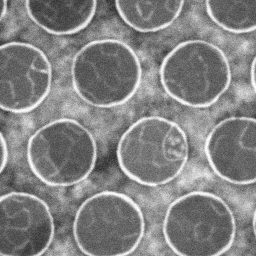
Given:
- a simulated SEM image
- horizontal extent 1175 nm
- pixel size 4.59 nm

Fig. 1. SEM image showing raised bodies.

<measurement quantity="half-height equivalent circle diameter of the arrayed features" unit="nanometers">307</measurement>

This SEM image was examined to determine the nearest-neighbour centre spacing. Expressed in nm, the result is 409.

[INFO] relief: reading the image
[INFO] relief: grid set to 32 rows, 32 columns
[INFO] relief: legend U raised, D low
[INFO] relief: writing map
UDDUUUUUUUUUDDDUUUUUUUUDDDUUUUUU
DDDDUUUUUUUUDDDUUUUUUUDDDDUUUUUU
DDDDUUUUUUUDDDDDUUUUUUDDDDDUUUUU
DDDDDDUUUUDDDDDDDUUUDDDDDDDDUUUU
DDDDDDDDDDDDDDDDDDDDDDDDDDDDDDDD
DUUDDDDDDDDUUUUUDDDDDDDUUUDDDDDD
UUUUUDDDDDUUUUUUUDDDDDUUUUUUDDDD
UUUUUUDDDUUUUUUUUDDDDUUUUUUUDDDD
UUUUUUDDDUUUUUUUUDDDUUUUUUUUUDDD
UUUUUUDDDUUUUUUUUDDDUUUUUUUUUDDD
UUUUUUDDDUUUUUUUUDDDUUUUUUUUDDDD
UUUUUUDDDDUUUUUUUDDDDUUUUUUUDDDD
UUUUUDDDDDDUUUUUDDDDDDUUUUUDDDDD
UUUUDDDDDDDDDDDDDDDDDDDDDDDDDDDD
DDDDDDDDDDDDDDDDDDDDDDDDDDDDDDDD
DDDDDDUUUUDDDDDDDUUUUUDDDDDUUUUU
DDDDDUUUUUUDDDDDUUUUUUUDDDUUUUUU
DDDDUUUUUUUUDDDUUUUUUUUDDDUUUUUU
UDDDUUUUUUUUDDDUUUUUUUUDDDUUUUUU
UDDDUUUUUUUUDDDUUUUUUUUDDDUUUUUU
DDDDUUUUUUUUDDDUUUUUUUUDDDDUUUUU
DDDDUUUUUUUDDDDDUUUUUUDDDDDUUUUU
DDDDDUUUUUDDDDDDDUUUUDDDDDDDDUUU
DDDDDDDDDDDDDDDDDDDDDDDDDDDDDDDD
DUUUDDDDDDDDUUUDDDDDDDDUUUUDDDDD
UUUUUUDDDDUUUUUUUDDDDDUUUUUUDDDD
UUUUUUDDDDUUUUUUUDDDDUUUUUUUUDDD
UUUUUUUDDUUUUUUUUUDDDUUUUUUUUDDD
UUUUUUUDDUUUUUUUUUDDDUUUUUUUUDDD
UUUUUUDDDUUUUUUUUUDDDUUUUUUUUDDD
UUUUUUDDDDUUUUUUUDDDDUUUUUUUUDDD
UUUUUDDDDDDUUUUUDDDDDDUUUUUUDDDD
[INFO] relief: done